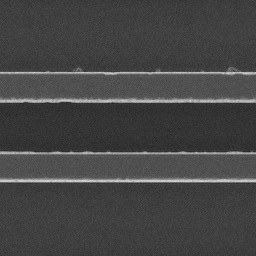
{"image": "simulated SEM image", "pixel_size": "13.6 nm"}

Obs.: lines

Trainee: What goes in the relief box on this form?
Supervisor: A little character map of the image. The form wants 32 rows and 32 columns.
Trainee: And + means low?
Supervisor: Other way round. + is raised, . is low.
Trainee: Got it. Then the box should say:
................................
................................
................................
................................
................................
................................
................................
................................
................................
++++++++++++++++++++++++++++++++
++++++++++++++++++++++++++++++++
++++++++++++++++++++++++++++++++
++++++++++++++++++++++++++++++++
................................
................................
................................
................................
................................
................................
++++++++++++++++++++++++++++++++
++++++++++++++++++++++++++++++++
++++++++++++++++++++++++++++++++
++++++++++++++++++++++++++++++++
................................
................................
................................
................................
................................
................................
................................
................................
................................